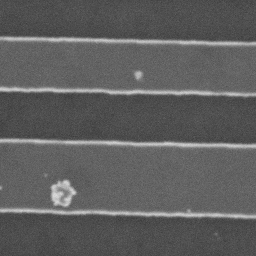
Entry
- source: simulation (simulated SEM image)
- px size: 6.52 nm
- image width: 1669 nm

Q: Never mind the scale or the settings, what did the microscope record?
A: lines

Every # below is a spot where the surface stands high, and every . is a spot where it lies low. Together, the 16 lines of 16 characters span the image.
................
................
#######.........
################
################
################
................
................
................
################
################
################
################
..............##
................
................